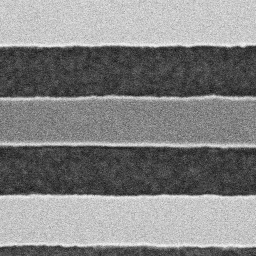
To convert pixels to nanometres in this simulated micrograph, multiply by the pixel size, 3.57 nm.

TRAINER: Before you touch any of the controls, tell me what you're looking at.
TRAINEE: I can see lines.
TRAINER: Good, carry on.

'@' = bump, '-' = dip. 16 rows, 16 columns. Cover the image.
@@@@@@@@@@@@@@@@
@@@@@@@@@@@@@@@@
@@@@@@@@@@@@@@@@
----------------
----------------
----------------
@@@@@@@@@@@@@@@@
@@@@@@@@@@@@@@@@
@@@@@@@@@@@@@@@@
----------------
----------------
----------------
@@@@@@@@@@@@@@@@
@@@@@@@@@@@@@@@@
@@@@@@@@@@@@@@@@
----------------